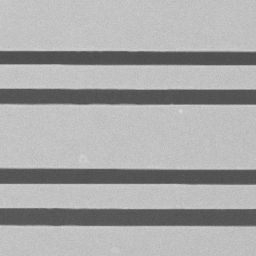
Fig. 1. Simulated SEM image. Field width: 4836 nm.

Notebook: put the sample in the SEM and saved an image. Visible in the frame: lines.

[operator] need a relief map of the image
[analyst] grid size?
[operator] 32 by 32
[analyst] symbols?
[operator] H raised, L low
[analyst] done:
HHHHHHHHHHHHHHHHHHHHHHHHHHHHHHHH
HHHHHHHHHHHHHHHHHHHHHHHHHHHHHHHH
HHHHHHHHHHHHHHHHHHHHHHHHHHHHHHHH
HHHHHHHHHHHHHHHHHHHHHHHHHHHHHHHH
HHHHHHHHHHHHHHHHHHHHHHHHHHHHHHHH
HHHHHHHHHHHHHHHHHHHHHHHHHHHHHHHH
LLLLLLLLLLLLLLLLLLLLLLLLLLLLLLLL
LLLLLLLLLLLLLLLLLLLLLLLLLLLLLLLL
HHHHHHHHHHHHHHHHHHHHHHHHHHHHHHHH
HHHHHHHHHHHHHHHHHHHHHHHHHHHHHHHH
HHHHHHHHHHHHHHHHHHHHHHHHHHHHHHHH
LLLLLLLLLLLLLLLLLLLLLLLLLLLLLLLL
LLLLLLLLLLLLLLLLLLLLLLLLLLLLLLLL
HHHHHHHHHHHHHHHHHHHHHHHHHHHHHHHH
HHHHHHHHHHHHHHHHHHHHHHHHHHHHHHHH
HHHHHHHHHHHHHHHHHHHHHHHHHHHHHHHH
HHHHHHHHHHHHHHHHHHHHHHHHHHHHHHHH
HHHHHHHHHHHHHHHHHHHHHHHHHHHHHHHH
HHHHHHHHHHHHHHHHHHHHHHHHHHHHHHHH
HHHHHHHHHHHHHHHHHHHHHHHHHHHHHHHH
HHHHHHHHHHHHHHHHHHHHHHHHHHHHHHHH
LLLLLLLLLLLLLLLLLLLLLLLLLLLLLLLL
LLLLLLLLLLLLLLLLLLLLLLLLLLLLLLLL
HHHHHHHHHHHHHHHHHHHHHHHHHHHHHHHH
HHHHHHHHHHHHHHHHHHHHHHHHHHHHHHHH
HHHHHHHHHHHHHHHHHHHHHHHHHHHHHHHH
LLLLLLLLLLLLLLLLLLLLLLLLLLLLLLLL
LLLLLLLLLLLLLLLLLLLLLLLLLLLLLLLL
HHHHHHHHHHHHHHHHHHHHHHHHHHHHHHHH
HHHHHHHHHHHHHHHHHHHHHHHHHHHHHHHH
HHHHHHHHHHHHHHHHHHHHHHHHHHHHHHHH
HHHHHHHHHHHHHHHHHHHHHHHHHHHHHHHH